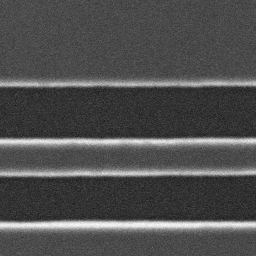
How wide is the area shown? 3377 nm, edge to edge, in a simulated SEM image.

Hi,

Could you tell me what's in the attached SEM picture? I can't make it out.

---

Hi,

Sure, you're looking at lines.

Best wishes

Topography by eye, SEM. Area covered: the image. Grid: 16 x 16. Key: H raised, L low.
HHHHHHHHHHHHHHHH
HHHHHHHHHHHHHHHH
HHHHHHHHHHHHHHHH
HHHHHHHHHHHHHHHH
HHHHHHHHHHHHHHHH
LLLLLLLLLLLLLLLL
LLLLLLLLLLLLLLLL
LLLLLLLLLLLLLLLL
LLLLLLLLLLLLLLLL
HHHHHHHHHHHHHHHH
HHHHHHHHHHHHHHHH
LLLLLLLLLLLLLLLL
LLLLLLLLLLLLLLLL
LLLLLLLLLLLLLLLL
HHHHHHHHHHHHHHHH
HHHHHHHHHHHHHHHH